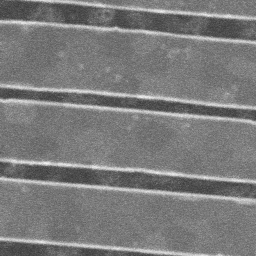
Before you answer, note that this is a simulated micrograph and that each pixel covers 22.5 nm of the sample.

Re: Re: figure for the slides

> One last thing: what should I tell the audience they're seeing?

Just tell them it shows one or a few lines or trenches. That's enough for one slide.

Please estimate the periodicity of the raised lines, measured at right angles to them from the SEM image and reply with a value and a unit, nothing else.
1.74 micrometres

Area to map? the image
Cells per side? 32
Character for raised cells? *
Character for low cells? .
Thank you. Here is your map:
..........**********************
.............*......************
................................
*************...................
***********************.........
********************************
********************************
********************************
********************************
********************************
********************************
...........*********************
.*....................**********
**************.................*
************************........
********************************
********************************
********************************
********************************
********************************
......**************************
...................*************
*...........................****
*************...................
**************************......
********************************
********************************
********************************
********************************
********************************
........************************
..................**************